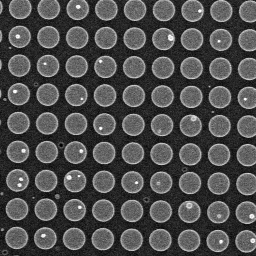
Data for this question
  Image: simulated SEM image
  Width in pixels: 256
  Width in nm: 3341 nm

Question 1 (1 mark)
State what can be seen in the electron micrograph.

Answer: an array of small figures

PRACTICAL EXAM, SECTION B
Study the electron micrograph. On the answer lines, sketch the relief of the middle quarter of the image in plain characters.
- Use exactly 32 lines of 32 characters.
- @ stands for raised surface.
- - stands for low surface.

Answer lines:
@@@@@@--@@@@@--@@@@@--@@@@@--@@@
-@@@@@--@@@@@--@@@@@--@@@@@--@@@
-@@@@---@@@@---@@@@@---@@@@---@@
------------------------@------@
--------------------------------
--@@@----@@@----@@--------------
-@@@@---@@@@@--@@@@@--@@@@@---@@
@@@@@@--@@@@@--@@@@@--@@@@@--@@@
@@@@@@--@@@@@--@@@@@--@@@@@--@@@
-@@@@---@@@@---@@@@@--@@@@@--@@@
---------@@-----@@------@@----@@
--------------------------------
--@@-----@@---------------------
-@@@@---@@@@---@@@@----@@@@---@@
@@@@@@-@@@@@@--@@@@@--@@@@@--@@@
@@@@@@-@@@@@@--@@@@@--@@@@@--@@@
-@@@@---@@@@---@@@@@--@@@@@--@@@
--@@-----@@-----@@@----@@@----@@
--------------------------------
--------------------------------
-@@@@---@@@@---@@@@----@@@----@@
@@@@@@-@@@@@@--@@@@@--@@@@@--@@@
@@@@@@-@@@@@@--@@@@@--@@@@@--@@@
-@@@@---@@@@---@@@@@--@@@@@--@@@
--@@----@@@@----@@@---@@@@----@@
--------------------------------
--------------------------------
-@@@@---@@@@---@@@@----@@@----@@
@@@@@--@@@@@---@@@@@--@@@@@--@@@
@@@@@--@@@@@@-@@@@@@--@@@@@--@@@
@@@@@--@@@@@---@@@@@--@@@@@--@@@
-@@@----@@@@---@@@@---@@@@---@@@